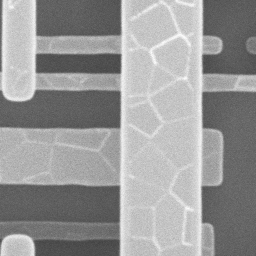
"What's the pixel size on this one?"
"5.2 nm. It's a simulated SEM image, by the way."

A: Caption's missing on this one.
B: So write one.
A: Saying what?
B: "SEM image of wiring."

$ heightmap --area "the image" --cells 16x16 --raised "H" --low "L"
HHLLLLLLHHHHHLLL
HHLLLLLLHHHHHLLL
HHLLLLLLHHHHHLLL
HHLLLLLLHHHHHLLL
HHLLLLLLHHHHHLLL
HHLLLLLLHHHHHLLL
LLLLLLLLHHHHHLLL
LLLLLLLLHHHHHLLL
LLLLLLLLHHHHHLLL
LLLLLLLLHHHHHLLL
LLLLLLLLHHHHHLLL
LLLLLLLLHHHHHLLL
LLLLLLLLHHHHHLLL
LLLLLLLLHHHHHLLL
LLLLLLLLHHHHHLLL
HHLLLLLLHHHHHLLL